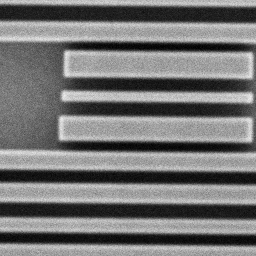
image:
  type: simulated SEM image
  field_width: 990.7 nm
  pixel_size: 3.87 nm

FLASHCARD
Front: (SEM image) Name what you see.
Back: groups of lines, slits or small figures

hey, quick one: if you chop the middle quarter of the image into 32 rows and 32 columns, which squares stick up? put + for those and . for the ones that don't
++++++++++++++++++++++++++++++++
++++++++++++++++++++++++++++++++
++++++++++++++++++++++++++++++++
................................
................................
................................
................................
++++++++++++++++++++++++++++++++
++++++++++++++++++++++++++++++++
................................
................................
................................
................................
++++++++++++++++++++++++++++++++
++++++++++++++++++++++++++++++++
++++++++++++++++++++++++++++++++
++++++++++++++++++++++++++++++++
++++++++++++++++++++++++++++++++
++++++++++++++++++++++++++++++++
................................
................................
................................
++++++++++++++++++++++++++++++++
++++++++++++++++++++++++++++++++
++++++++++++++++++++++++++++++++
++++++++++++++++++++++++++++++++
....................++++++++++++
................................
................................
................................
++++++++++++++++++++++++++++++++
++++++++++++++++++++++++++++++++